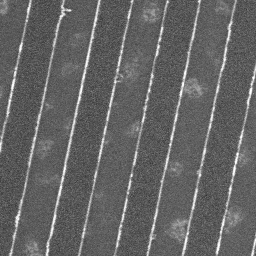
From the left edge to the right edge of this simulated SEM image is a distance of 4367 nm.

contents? one or a few lines or trenches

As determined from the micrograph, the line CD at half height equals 553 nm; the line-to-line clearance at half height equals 587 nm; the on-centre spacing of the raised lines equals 1140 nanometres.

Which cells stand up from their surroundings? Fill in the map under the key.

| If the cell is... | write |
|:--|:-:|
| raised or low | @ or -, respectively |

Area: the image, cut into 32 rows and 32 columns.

----@@@@----@@@@-----@@@@----@@@
---@@@@@----@@@@-----@@@@----@@@
---@@@@@----@@@@----@@@@@----@@@
---@@@@-----@@@@----@@@@-----@@@
---@@@@-----@@@@----@@@@-----@@@
---@@@@----@@@@-----@@@@----@@@@
--@@@@@----@@@@-----@@@@----@@@@
--@@@@-----@@@@----@@@@@----@@@@
--@@@@-----@@@@----@@@@-----@@@@
--@@@@----@@@@@----@@@@----@@@@@
--@@@@----@@@@-----@@@@----@@@@@
-@@@@@----@@@@-----@@@@----@@@@-
-@@@@-----@@@@----@@@@@----@@@@-
-@@@@-----@@@@----@@@@-----@@@@-
-@@@@----@@@@@----@@@@----@@@@@-
-@@@@----@@@@-----@@@@----@@@@@-
@@@@@----@@@@-----@@@@----@@@@--
@@@@-----@@@@----@@@@-----@@@@--
@@@@-----@@@@----@@@@-----@@@@--
@@@@----@@@@@----@@@@----@@@@@--
@@@@----@@@@-----@@@@----@@@@---
@@@-----@@@@----@@@@@----@@@@---
@@@-----@@@@----@@@@-----@@@@---
@@@-----@@@@----@@@@-----@@@@---
@@@----@@@@-----@@@@----@@@@@---
@@@----@@@@-----@@@@----@@@@----
@@-----@@@@----@@@@@----@@@@----
@@-----@@@@----@@@@-----@@@@----
@@-----@@@@----@@@@-----@@@@----
@@----@@@@-----@@@@----@@@@@----
@@----@@@@-----@@@@----@@@@-----
@-----@@@@----@@@@@----@@@@-----